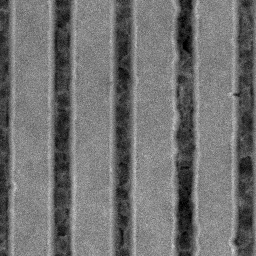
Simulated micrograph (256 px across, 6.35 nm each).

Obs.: one or a few lines or trenches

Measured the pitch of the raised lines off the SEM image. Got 0.389 um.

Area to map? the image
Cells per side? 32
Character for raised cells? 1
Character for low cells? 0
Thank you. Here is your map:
01111110011111000111110011111000
01111110011111000111110011111100
01111110011111000111110011111100
01111110011111000111110011111100
01111110011111000111110011111000
01111110011111000111110011111000
01111110011111000111110011111100
01111110011111000111110011111100
01111110011111000111110011111000
00111110011111000111110011111000
01111110011111000111110011111000
01111110011111000111110011111000
01111110011111000111110011111100
01111110011111000111110001111100
01111110011111000111110011111100
01111110011111000111110011111100
01111110011111000111110011111100
01111110011111000111110011111000
01111110011111000111110011111000
01111110011111000111110011111000
01111110011111000111110011111000
01111110011111000111110011111000
01111110011111000111110011111000
00111100011111001111110011111000
01111100011111001111110011111000
01111100011111001111110011111100
01111100011111000111110011111100
01111100011111000111110011111000
01111100011111000111110011111000
01111100011111000111110011111000
01111100011111000111110011111000
01111100011111000111110011111000